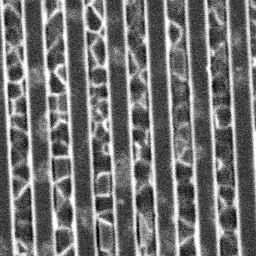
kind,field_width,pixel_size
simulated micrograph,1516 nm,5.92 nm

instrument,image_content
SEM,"parallel lines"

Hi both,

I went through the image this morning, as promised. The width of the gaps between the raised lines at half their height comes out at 115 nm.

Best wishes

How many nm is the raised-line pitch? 242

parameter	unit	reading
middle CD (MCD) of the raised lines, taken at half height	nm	130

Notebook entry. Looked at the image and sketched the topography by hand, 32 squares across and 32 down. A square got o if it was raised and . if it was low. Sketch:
...oo...ooo..ooo..ooo..ooo..ooo.
...oo...ooo..ooo..ooo..ooo..ooo.
...oo...ooo..ooo..ooo..ooo..ooo.
...ooo..ooo..ooo..ooo..ooo..ooo.
o..ooo..ooo..ooo..ooo..ooo..ooo.
o..ooo..ooo..ooo..ooo..ooo...oo.
o..ooo..ooo..ooo..ooo..ooo...oo.
o..ooo..ooo..ooo..ooo.oooo...oo.
o..ooo..ooo..ooo..ooo.oooo...oo.
o..ooo..ooo..ooo..ooo...oo...oo.
o..ooo..ooo..ooo...oo...oo...oo.
o..ooo..ooo...oo...oo...oo...ooo
o..ooo...oo...oo...oo...oo...ooo
o..ooo...oo...oo...oo...ooo..ooo
o..ooo...oo...oo...oo...ooo..ooo
o..ooo...oo...oo...oo...ooo..ooo
o...oo...oo...oo...ooo..ooo..ooo
o...oo...oo...ooo..ooo..ooo..ooo
o...oo...oo...ooo..ooo..ooo..ooo
o...oo...ooo..ooo..ooo..ooo..ooo
o...oooo.ooo..ooo..ooo..ooo..ooo
o...oooo.ooo..ooo..ooo..ooo..ooo
o...ooo..oooooooo..ooo..ooo..ooo
oo..ooo..oooooooo..ooo..ooo..ooo
oo..ooo..ooo..ooo..ooo..ooo..ooo
oo..ooo..ooo..ooo..ooo..ooo...oo
oo..ooo..ooo..ooo..ooo...oo...oo
oo..ooo..ooo..ooo..ooo...oo...oo
oo..ooo..ooooooooo.ooo...oo...oo
oo..ooo..oooooooo...oo...oo...oo
oo..ooo..ooo.oooo...oo...oo...oo
oo..ooo..ooo...oo...oo...oo...oo